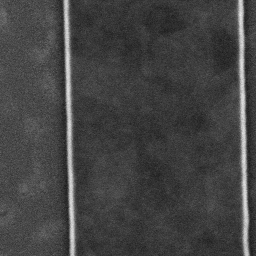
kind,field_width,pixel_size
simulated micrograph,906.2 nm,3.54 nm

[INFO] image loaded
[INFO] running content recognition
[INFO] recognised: one or a few lines or trenches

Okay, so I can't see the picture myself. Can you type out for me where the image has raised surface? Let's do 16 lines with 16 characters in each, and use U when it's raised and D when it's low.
DDDDUUUUUUUUUUUD
DDDDUUUUUUUUUUUD
DDDDUUUUUUUUUUUD
DDDDUUUUUUUUUUUD
DDDDUUUUUUUUUUUD
DDDDUUUUUUUUUUUD
DDDDUUUUUUUUUUUD
DDDDUUUUUUUUUUUD
DDDDUUUUUUUUUUUD
DDDDUUUUUUUUUUUD
DDDDUUUUUUUUUUUD
DDDDUUUUUUUUUUUD
DDDDUUUUUUUUUUUD
DDDDUUUUUUUUUUUD
DDDDUUUUUUUUUUUD
DDDDDUUUUUUUUUUD